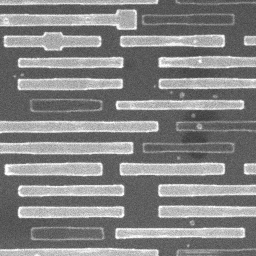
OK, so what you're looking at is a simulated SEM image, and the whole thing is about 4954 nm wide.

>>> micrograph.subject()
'wiring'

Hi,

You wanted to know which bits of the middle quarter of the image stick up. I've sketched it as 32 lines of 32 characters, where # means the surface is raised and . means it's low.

###############.........########
................................
................................
................................
##############..........########
##############..........########
................................
.............................#..
................................
#########....###################
#########....###################
########........................
................................
................................
................................
#######################.....####
#######################......###
................................
................................
................................
#################...############
#################...############
................................
................................
................................
#########.....##################
#########.....##################
#########.....#####....#########
................................
................................
............###.........########
###############.........########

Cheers